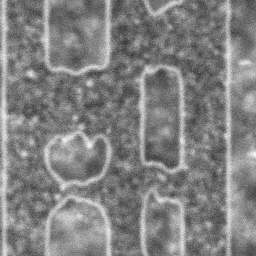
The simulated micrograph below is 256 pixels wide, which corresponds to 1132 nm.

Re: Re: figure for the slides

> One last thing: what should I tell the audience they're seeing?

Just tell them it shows one or a few lines or trenches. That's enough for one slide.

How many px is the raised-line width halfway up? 47.3